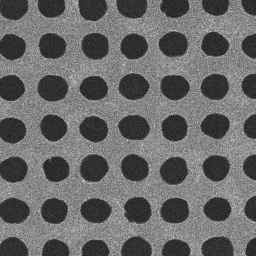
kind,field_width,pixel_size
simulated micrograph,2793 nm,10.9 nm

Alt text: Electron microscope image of a regular array of holes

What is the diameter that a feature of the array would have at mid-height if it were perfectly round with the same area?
26.5 pixels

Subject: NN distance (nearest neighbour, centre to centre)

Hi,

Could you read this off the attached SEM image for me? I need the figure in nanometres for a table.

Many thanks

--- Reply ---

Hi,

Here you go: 433